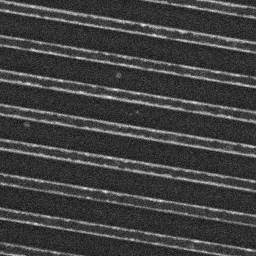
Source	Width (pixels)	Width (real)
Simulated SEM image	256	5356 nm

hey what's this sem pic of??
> parallel lines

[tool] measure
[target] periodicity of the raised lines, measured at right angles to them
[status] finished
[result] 715 nanometres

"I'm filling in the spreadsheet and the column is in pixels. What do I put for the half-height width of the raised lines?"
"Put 10.5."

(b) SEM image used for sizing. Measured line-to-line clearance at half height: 496 nm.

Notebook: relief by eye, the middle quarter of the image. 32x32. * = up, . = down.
................**************..
......................**********
............................****
................................
**..............................
********........................
**************..................
.....***************............
............**************......
..................**************
........................********
.............................***
................................
****............................
**********......................
..**************................
........**************..........
..............**************....
....................************
..........................******
................................
................................
******..........................
************....................
...***************..............
.........***************........
...............***************..
.....................***********
...........................*****
................................
**..............................
********........................